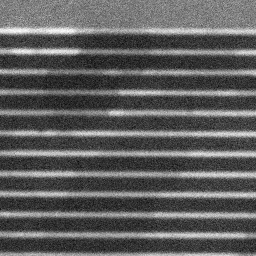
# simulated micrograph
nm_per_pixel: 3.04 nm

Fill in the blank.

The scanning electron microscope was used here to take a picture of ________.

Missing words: parallel lines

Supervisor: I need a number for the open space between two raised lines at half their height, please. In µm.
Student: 0.0487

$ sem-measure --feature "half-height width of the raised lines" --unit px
4.38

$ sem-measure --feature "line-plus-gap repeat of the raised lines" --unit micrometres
0.0619